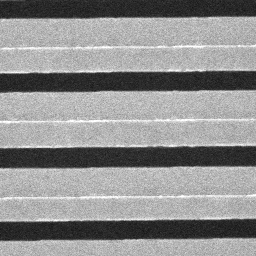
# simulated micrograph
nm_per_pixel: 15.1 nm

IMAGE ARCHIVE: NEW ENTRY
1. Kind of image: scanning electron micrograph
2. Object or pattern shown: lines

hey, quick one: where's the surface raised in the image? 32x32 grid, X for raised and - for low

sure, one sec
--------------------------------
--------------------------------
XXXXXXXXXXXXXXXXXXXXXXXXXXXXXXXX
XXXXXXXXXXXXXXXXXXXXXXXXXXXXXXXX
XXXXXXXXXXXXXXXXXXXXXXXXXXXXXXXX
XXXXXXXXXXXXXXXXXXXXXXXXXXXXXXXX
XXXXXXXXXXXXXXXXXXXXXXXXXXXXXXXX
XXXXXXXXXXXXXXXXXXXXXXXXXXXXXXXX
XXXXXXXXXXXXXXXXXXXXXXXXXXXXXXXX
--------------------------------
--------------------------------
------------XXXXXXXXXXXXXXXXXXXX
XXXXXXXXXXXXXXXXXXXXXXXXXXXXXXXX
XXXXXXXXXXXXXXXXXXXXXXXXXXXXXXXX
XXXXXXXXXXXXXXXXXXXXXXXXXXXXXXXX
XXXXXXXXXXXXXXXXXXXXXXXXXXXXXXXX
XXXXXXXXXXXXXXXXXXXXXXXXXXXXXXXX
XXXXXXXXXXXXXXXXXXXXXXXXXXXXXXXX
--------------------------------
--------------------------------
--------------------------------
XXXXXXXXXXXXXXXXXXXXXXXXXXXXXXXX
XXXXXXXXXXXXXXXXXXXXXXXXXXXXXXXX
XXXXXXXXXXXXXXXXXXXXXXXXXXXXXXXX
XXXXXXXXXXXXXXXXXXXXXXXXXXXXXXXX
XXXXXXXXXXXXXXXXXXXXXXXXXXXXXXXX
XXXXXXXXXXXXXXXXXXXXXXXXXXXXXXXX
XXXXXXXXXXX---------------------
--------------------------------
--------------------------------
XXXXXXXXXXXXXXXXXXXXXXXXXXXXXXXX
XXXXXXXXXXXXXXXXXXXXXXXXXXXXXXXX